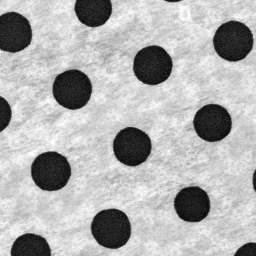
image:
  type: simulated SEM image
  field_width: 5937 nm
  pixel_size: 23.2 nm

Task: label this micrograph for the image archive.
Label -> a regular array of holes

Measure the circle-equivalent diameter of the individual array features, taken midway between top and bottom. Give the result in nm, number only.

933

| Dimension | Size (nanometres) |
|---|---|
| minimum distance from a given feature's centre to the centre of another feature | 1930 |